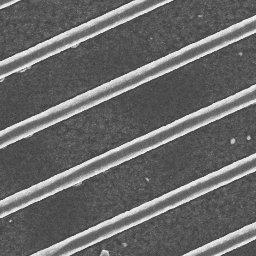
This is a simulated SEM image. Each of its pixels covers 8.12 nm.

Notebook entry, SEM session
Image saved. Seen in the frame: lines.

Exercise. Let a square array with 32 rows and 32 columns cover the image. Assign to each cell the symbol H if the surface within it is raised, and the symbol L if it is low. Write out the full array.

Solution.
HLLLLLLLLLLLLLLLHHHHHLLLLLLLLLLL
LLLLLLLLLLLLLLHHHHLLLLLLLLLLLLLL
LLLLLLLLLLLLHHHHLLLLLLLLLLLLLLLH
LLLLLLLLLLHHHHLLLLLLLLLLLLLLLHHH
LLLLLLLHHHHHLLLLLLLLLLLLLLLHHHHL
LLLLLHHHHLLLLLLLLLLLLLLLHHHHHLLL
LLLHHHHLLLLLLLLLLLLLLLHHHHHLLLLL
LHHHHLLLLLLLLLLLLLLLHHHHLLLLLLLL
HHHLLLLLLLLLLLLLLLHHHHLLLLLLLLLL
HLLLLLLLLLLLLLLLHHHHLLLLLLLLLLLL
LLLLLLLLLLLLLHHHHHLLLLLLLLLLLLLL
LLLLLLLLLLLHHHHLLLLLLLLLLLLLLLHH
LLLLLLLLLHHHHLLLLLLLLLLLLLLLHHHH
LLLLLLLHHHHLLLLLLLLLLLLLLLHHHHLL
LLLLLHHHHLLLLLLLLLLLLLLLHHHHLLLL
LLHHHHHLLLLLLLLLLLLLLHHHHHLLLLLL
HHHHLLLLLLLLLLLLLLLHHHHHLLLLLLLL
HHLLLLLLLLLLLLLLLHHHHLLLLLLLLLLL
LLLLLLLLLLLLLLLHHHHLLLLLLLLLLLLL
LLLLLLLLLLLLHHHHHLLLLLLLLLLLLLLH
LLLLLLLLLLHHHHHLLLLLLLLLLLLLLHHH
LLLLLLLLHHHHHLLLLLLLLLLLLLLHHHHH
LLLLLLHHHHLLLLLLLLLLLLLLLHHHHLLL
LLLLHHHHLLLLLLLLLLLLLLLHHHHLLLLL
LLHHHHLLLLLLLLLLLLLLLHHHHLLLLLLL
HHHHLLLLLLLLLLLLLLHHHHHLLLLLLLLL
HHLLLLLLLLLLLLLLHHHHLLLLLLLLLLLL
LLLLLLLLLLLLLLHHHHLLLLLLLLLLLLLL
LLLLLLLLLLLLHHHHLLLLLLLLLLLLLLLH
LLLLLLLLLHHHHHLLLLLLLLLLLLLLLHHH
LLLLLLLHHHHHLLLLLLLLLLLLLLHHHHHL
LLLLLHHHHLLLLLLLLLLLLLLLHHHHLLLL